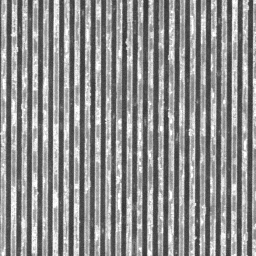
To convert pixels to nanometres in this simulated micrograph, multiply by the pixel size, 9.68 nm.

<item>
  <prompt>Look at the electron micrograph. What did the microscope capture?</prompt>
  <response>parallel lines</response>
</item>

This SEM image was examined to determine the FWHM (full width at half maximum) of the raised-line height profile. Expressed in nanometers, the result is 44.8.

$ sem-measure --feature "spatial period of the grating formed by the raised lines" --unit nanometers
102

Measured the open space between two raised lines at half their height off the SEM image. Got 53.3 nm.